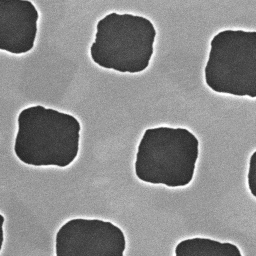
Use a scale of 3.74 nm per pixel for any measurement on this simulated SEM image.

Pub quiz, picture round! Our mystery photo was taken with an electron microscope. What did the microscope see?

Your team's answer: holes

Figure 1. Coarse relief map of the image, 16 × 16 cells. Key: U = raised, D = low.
DDUUUUUUUUUUUUUU
DDUUUUDDDUUUUUUU
DDUUUUDDDDUUUDDD
UUUUUUDDDUUUUDDD
UUUUUUUUUUUUUDDD
UUUUUUUUUUUUUDDD
UUUUUUUUUUUUUUUU
UDDDDUUUUUUUUUUU
UDDDDUUUUDDDUUUU
UDDDDUUUUDDDUUUU
UUUUUUUUDDDDUUUU
UUUUUUUUUUDDUUUU
UUUUUUUUUUUUUUUU
UUUUUUUUUUUUUUUU
UUUUDDDDUUUUUUUU
UUUDDDDDUUUDDDDU